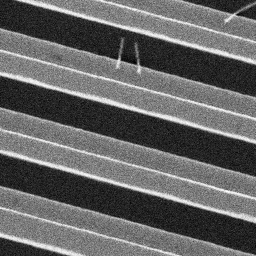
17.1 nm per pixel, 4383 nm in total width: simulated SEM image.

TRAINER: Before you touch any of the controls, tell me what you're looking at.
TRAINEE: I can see lines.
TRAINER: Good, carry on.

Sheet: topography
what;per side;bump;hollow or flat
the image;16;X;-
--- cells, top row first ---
---XXXXXXXXXX---
-------XXXXXXXXX
XXX-------XXXXXX
XXXXXX--------XX
XXXXXXXXXX------
---XXXXXXXXXXX--
-------XXXXXXXXX
XXX--------XXXXX
XXXXXXX-------XX
XXXXXXXXXX------
---XXXXXXXXXXX--
-------XXXXXXXXX
XXX--------XXXXX
XXXXXXX-------XX
XXXXXXXXXXX-----
---XXXXXXXXXXX--